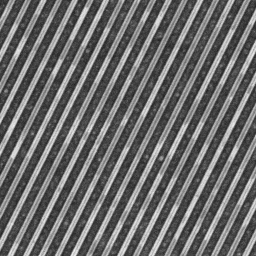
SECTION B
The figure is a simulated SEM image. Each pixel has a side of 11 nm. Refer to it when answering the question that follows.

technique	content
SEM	parallel lines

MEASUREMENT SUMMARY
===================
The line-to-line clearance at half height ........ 10.4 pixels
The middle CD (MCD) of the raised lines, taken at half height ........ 38.1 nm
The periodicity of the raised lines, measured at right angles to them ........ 0.154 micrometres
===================